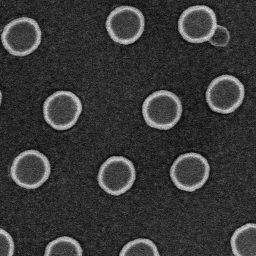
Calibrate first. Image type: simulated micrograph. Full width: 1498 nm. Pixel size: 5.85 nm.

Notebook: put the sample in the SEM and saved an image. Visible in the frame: a regular array of raised bodies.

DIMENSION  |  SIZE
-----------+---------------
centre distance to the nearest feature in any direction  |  395 nanometres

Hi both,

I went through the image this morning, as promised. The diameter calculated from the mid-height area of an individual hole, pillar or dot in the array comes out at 208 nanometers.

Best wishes